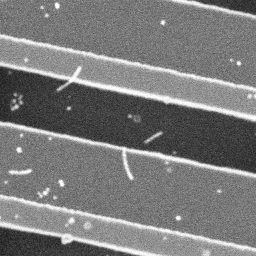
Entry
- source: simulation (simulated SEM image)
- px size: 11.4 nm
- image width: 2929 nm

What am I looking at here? lines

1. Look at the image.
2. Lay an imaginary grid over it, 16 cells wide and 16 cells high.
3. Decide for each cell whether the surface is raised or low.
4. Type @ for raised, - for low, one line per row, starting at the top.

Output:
@@@@@@@@@@@@@---
@@@@@@@@@@@@@@@@
@@@@@@@@@@@@@@@@
@@@@@@@@@@@@@@@@
--@@@@@@@@@@@@@@
-------@@@@@@@@@
------------@@@@
----------------
@@@@------------
@@@@@@@@@-------
@@@@@@@@@@@@@@--
@@@@@@@@@@@@@@@@
@@@@@@@@@@@@@@@@
@@@@@@@@@@@@@@@@
--@@@@@@@@@@@@@@
-------@@@@@@@@@